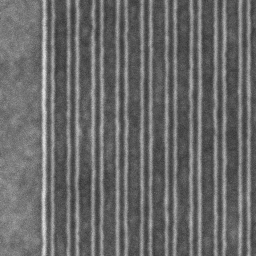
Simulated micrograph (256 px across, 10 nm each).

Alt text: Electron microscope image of parallel lines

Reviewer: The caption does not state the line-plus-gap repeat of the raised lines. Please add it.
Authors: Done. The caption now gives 246 nm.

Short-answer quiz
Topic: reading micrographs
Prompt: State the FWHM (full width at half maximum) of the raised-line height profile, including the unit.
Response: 97.9 nanometers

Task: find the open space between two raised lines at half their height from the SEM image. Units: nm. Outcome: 156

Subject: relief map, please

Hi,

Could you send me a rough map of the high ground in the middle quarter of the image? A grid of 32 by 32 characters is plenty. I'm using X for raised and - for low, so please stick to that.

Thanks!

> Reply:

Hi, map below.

-XX----XXX---XXX----XX----XX----
-XX----XXX---XXX----XX----XX----
-XX----XX----XXX----XX----XX----
-XX----XX----XX-----XX----XX----
-XX----XXX---XXX----XX----XX----
-XX----XXX---XXX----XX----XX----
-XX----XXX---XXX----XX----XX----
-XX----XXX---XXX----XX----XX----
-XX----XXX---XXX----XX----XX----
-XX----XXX---XXX----XX----XX----
-XX----XXX---XX-----XX----XX----
-XX----XXX---XXX----XX----XX----
-XX----XXX---XXX----XX----XX----
-XX----XXX---XXX----XX----XX----
-XX----XXX---XXX----XX----XX----
-XX----XX----XXX----XX----XX----
-XX----XX----XXX----XX----XX----
-XX----XX----XXX---XXX----XX----
-XX----XXX---XXX---XXX----XX----
-XX----XXX---XXX---XXX----XX----
-XX----XXX---XXX----XX----XX----
-XX----XXX---XXX----XX----XX----
-XX----XXX---XXX----XX----XX----
-XX----XXX---XXX----XX----XX----
-XX----XXX---XXX----XX----XX----
-XX----XXX---XXX----XX----XX----
-XX----XXX---XXX---XXX----XX----
-XX----XXX---XXX---XXX----XX----
-XX----XXX---XXX----XX----XX----
-XX----XXX---XX-----XX----XX----
-XX----XX----XXX----XX----XX----
-XX----XXX---XXX----XX----XX----